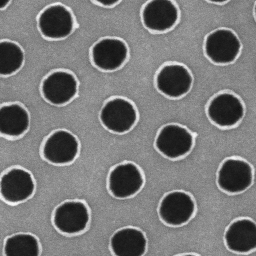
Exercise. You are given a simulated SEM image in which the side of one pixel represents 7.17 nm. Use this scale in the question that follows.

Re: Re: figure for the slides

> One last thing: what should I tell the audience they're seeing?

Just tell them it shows a regular array of raised bodies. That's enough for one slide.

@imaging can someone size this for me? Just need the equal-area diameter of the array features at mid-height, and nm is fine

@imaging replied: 271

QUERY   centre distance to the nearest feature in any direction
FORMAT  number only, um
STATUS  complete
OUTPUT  0.428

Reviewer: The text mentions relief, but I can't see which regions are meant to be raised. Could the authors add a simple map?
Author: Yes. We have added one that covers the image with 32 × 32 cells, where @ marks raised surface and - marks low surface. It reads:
@------@----@@@---@@@@-----@----
-----@@@@---------@@@@----------
-----@@@@@--------@@@@----------
-----@@@@@--------@@@@-----@----
-----@@@@-----------------@@@@--
@@----------@@@@----------@@@@--
@@@--------@@@@@----------@@@@--
@@@--------@@@@@----------@@@@--
@@@---------@@@-----@@@---------
@-----@@@----------@@@@@--------
-----@@@@@---------@@@@@--------
-----@@@@@----------@@@@----@---
------@@@----@@@----------@@@@--
@@@----------@@@@---------@@@@@-
@@@@--------@@@@@---------@@@@--
@@@@---------@@@@----@-----@@@--
@@@----@@-----@@----@@@@--------
------@@@@---------@@@@@--------
-----@@@@@---------@@@@@--------
-----@@@@@----------@@@---------
-------@@------@@-----------@@@-
-@@@----------@@@@---------@@@@@
@@@@---------@@@@@---------@@@@@
@@@@---------@@@@@---------@@@@-
@@@@----------@@@---@@@@--------
-@-----@@@@---------@@@@--------
-------@@@@---------@@@@--------
-------@@@@---------@@@@-----@@@
-------@@@@----@@-----------@@@@
-@@@----------@@@@----------@@@@
@@@@@---------@@@@----------@@@@
@@@@@---------@@@@-----------@@-